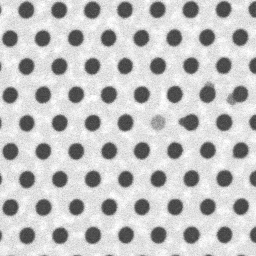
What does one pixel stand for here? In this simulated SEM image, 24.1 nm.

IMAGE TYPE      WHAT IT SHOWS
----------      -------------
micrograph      a regular array of holes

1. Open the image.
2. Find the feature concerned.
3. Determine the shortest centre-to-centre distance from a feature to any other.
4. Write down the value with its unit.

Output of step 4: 0.78 micrometres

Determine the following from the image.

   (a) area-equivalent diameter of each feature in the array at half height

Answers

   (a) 405 nanometers